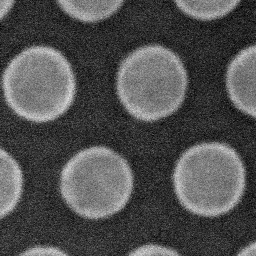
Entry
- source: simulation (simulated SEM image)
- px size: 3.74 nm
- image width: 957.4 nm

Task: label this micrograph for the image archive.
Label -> raised bodies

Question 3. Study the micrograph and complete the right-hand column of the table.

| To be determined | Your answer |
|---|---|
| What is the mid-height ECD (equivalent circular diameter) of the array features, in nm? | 255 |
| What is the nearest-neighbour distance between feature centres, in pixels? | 113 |